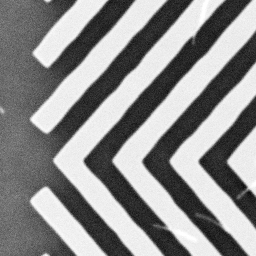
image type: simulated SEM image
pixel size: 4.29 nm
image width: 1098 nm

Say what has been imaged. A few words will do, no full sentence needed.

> groups of lines, slits or small figures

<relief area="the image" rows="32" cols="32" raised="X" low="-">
---------XXXX----XXX----XXXX---X
--------XXXX----XXX----XXXX---XX
-------XXXX----XXXX---XXXX---XXX
-------XXX----XXXX---XXXX---XXXX
------XXXX---XXXX---XXXX----XXX-
-----XXXX---XXXX---XXXX----XXXX-
----XXXX---XXXX----XXX----XXXX--
-----XX----XXX----XXX----XXXX---
----------XXX----XXXX---XXXX---X
---------XXX----XXXX---XXXX----X
--------XXX----XXXX---XXXX----XX
-------XXXX---XXXX---XXXX----XXX
------XXXX---XXXX----XXX----XXX-
-----XXXX---XXXX----XXX----XXXX-
----XXXX---XXXX----XXX----XXXX--
----XXX----XXX----XXXX---XXXX---
----------XXX----XXXX---XXXX---X
---------XXXX---XXXX---XXXX----X
--------XXXX---XXXX---XXXX----XX
-------XXXX---XXXX----XXX----XXX
-------XXXX---XXXX---XXXX----XXX
--------XXX----XXXX---XXXX---XXX
---------XXX----XXX----XXXX---XX
----------XXX----XXX----XXX----X
----XXX---XXXX----XXX----XXX----
----XXXX---XXXX---XXXX----XXX---
-----XXXX---XXXX---XXXX---XXXX--
------XXX----XXX----XXXX---XXXX-
-------XXX----XXX----XXXX---XXXX
--------XXX----XXX----XXXX---XXX
--------XXXX----XXX----XXX----XX
---------XXXX---XXXX----XXX----X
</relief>